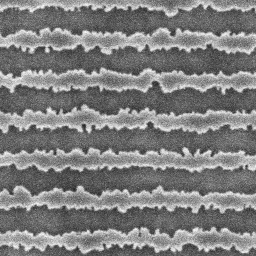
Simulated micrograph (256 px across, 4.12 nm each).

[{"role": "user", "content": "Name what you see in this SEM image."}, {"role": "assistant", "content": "parallel lines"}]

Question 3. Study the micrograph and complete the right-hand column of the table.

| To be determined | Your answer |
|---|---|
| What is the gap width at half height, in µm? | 0.0989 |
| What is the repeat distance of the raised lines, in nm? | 164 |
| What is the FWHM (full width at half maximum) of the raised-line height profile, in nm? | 63.4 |